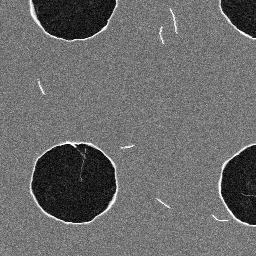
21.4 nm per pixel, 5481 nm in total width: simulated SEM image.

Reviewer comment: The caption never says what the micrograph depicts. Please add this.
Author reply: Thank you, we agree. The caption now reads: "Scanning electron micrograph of holes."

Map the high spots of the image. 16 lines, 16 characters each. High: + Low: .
++.....+++++++..
+++....++++++++.
++++.+++++++++++
++++++++++++++++
++++++++++++++++
++++++++++++++++
++++++++++++++++
++++++++++++++++
++++++++++++++++
+++...+++++++++.
++.....+++++++..
++.....+++++++..
++.....+++++++..
+++...+++++++++.
++++++++++++++++
++++++++++++++++